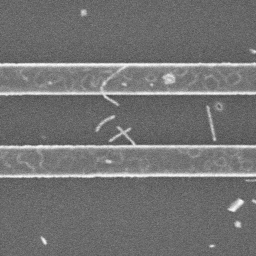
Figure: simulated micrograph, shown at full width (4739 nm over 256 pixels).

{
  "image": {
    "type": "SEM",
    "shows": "lines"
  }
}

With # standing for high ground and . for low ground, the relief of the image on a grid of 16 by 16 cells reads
................
................
................
................
################
################
................
................
................
################
################
................
................
................
................
................